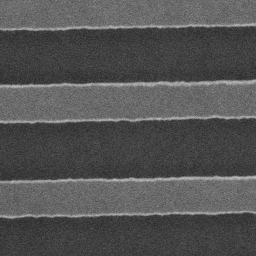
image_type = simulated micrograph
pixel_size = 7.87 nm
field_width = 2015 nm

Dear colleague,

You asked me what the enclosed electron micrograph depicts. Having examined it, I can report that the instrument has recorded lines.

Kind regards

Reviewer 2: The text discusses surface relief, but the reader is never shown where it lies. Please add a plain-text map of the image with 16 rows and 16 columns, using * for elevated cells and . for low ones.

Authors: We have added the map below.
****************
****************
................
................
................
****************
****************
*********.......
................
................
................
****************
****************
******..........
................
................